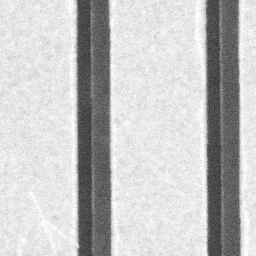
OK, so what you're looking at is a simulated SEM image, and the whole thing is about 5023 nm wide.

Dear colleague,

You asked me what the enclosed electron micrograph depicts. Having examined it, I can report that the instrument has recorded lines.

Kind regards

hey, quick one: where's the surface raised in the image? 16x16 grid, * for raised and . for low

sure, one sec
*****..******..*
*****..******..*
*****..******..*
*****..******..*
*****..******..*
*****..******..*
*****..******..*
*****..******..*
*****..******..*
*****..******..*
*****..******..*
*****..******..*
*****..******..*
*****..******..*
*****..******..*
*****..******..*